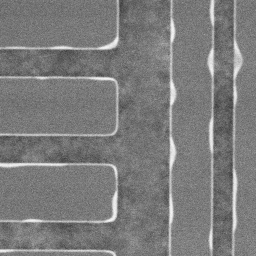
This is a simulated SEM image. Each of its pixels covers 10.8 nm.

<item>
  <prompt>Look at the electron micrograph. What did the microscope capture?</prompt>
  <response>groups of lines, slits or small figures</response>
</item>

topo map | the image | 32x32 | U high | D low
UUUUUUUUUUUUUUUDDDDDDUUUUUUDDUUU
UUUUUUUUUUUUUUUDDDDDDUUUUUUDDUUU
UUUUUUUUUUUUUUUDDDDDDUUUUUUDDUUU
UUUUUUUUUUUUUUUDDDDDDDUUUUUDDUUU
UUUUUUUUUUUUUUUDDDDDDDUUUUUDDUUU
UUUUUUUUUUUUUUDDDDDDDUUUUUUDDUUU
DDDDDDDDDDDDDDDDDDDDDUUUUUUDDDUU
DDDDDDDDDDDDDDDDDDDDDUUUUUDDDDUU
DDDDDDDDDDDDDDDDDDDDDUUUUUDDDDUU
DDDDDDDDDDDDDDDDDDDDDUUUUUUDDUUU
UUUUUUUUUUUUUUUDDDDDDUUUUUUDDUUU
UUUUUUUUUUUUUUUDDDDDDDUUUUUDDUUU
UUUUUUUUUUUUUUUDDDDDDUUUUUUDDUUU
UUUUUUUUUUUUUUUDDDDDDUUUUUUDDUUU
UUUUUUUUUUUUUUUDDDDDDUUUUUUDDUUU
UUUUUUUUUUUUUUUDDDDDDUUUUUUDDUUU
UUUUUUUUUUUUUUDDDDDDDUUUUUDDDUUU
DDDDDDDDDDDDDDDDDDDDDUUUUUDDDUUU
DDDDDDDDDDDDDDDDDDDDDDUUUUUDDUUU
DDDDDDDDDDDDDDDDDDDDDDUUUUUDDUUU
DDDDDDDDDDDDDDDDDDDDDUUUUUUDDUUU
UUUUUUUUUUUUUUDDDDDDDUUUUUUDDUUU
UUUUUUUUUUUUUUUDDDDDDUUUUUUDDUUU
UUUUUUUUUUUUUUUDDDDDDUUUUUUDDUUU
UUUUUUUUUUUUUUDDDDDDDUUUUUUDDUUU
UUUUUUUUUUUUUUDDDDDDDUUUUUUDDUUU
UUUUUUUUUUUUUUDDDDDDDUUUUUUDDUUU
UUUUUUUUUUUUUUDDDDDDDUUUUUUDDUUU
DDDDDDDDDDDDDDDDDDDDDUUUUUUDDUUU
DDDDDDDDDDDDDDDDDDDDDUUUUUDDDUUU
DDDDDDDDDDDDDDDDDDDDDUUUUUDDDUUU
UUUUUUUUUUUUUUDDDDDDDUUUUUDDDUUU